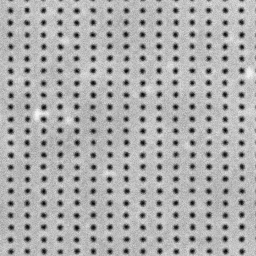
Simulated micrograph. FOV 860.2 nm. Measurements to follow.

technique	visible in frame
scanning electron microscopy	a regular array of holes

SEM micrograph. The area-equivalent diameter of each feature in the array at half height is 18.6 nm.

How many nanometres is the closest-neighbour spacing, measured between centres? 39.8